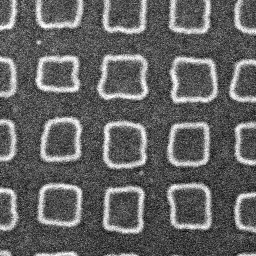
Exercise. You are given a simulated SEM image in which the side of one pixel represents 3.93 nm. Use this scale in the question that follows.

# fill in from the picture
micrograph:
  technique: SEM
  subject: a regular array of raised bodies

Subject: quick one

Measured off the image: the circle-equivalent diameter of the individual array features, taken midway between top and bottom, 170 nanometers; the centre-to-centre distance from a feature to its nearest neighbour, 252 nm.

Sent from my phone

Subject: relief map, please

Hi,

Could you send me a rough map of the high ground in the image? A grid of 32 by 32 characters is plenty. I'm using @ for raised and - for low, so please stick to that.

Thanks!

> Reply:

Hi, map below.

@@---@@@@@---@@@@@----@@@@----@@
@@---@@@@@---@@@@@----@@@@----@@
@@---@@@@@---@@@@@---@@@@@----@@
-------------@@@@@----@@@@----@@
--------------------------------
--------------------------------
--------------------------------
@----@@@@----@@@@@----@@--------
@@---@@@@@---@@@@@----@@@@@---@@
@@---@@@@----@@@@@----@@@@@--@@@
@@---@@@@@---@@@@@----@@@@@--@@@
@@-----------@@@@@----@@@@@--@@@
----------------------@@@@------
--------------------------------
--------------------------------
@-----@@@@----@@----------------
@@----@@@@---@@@@@---@@@@@----@@
@@---@@@@@---@@@@@---@@@@@----@@
@@---@@@@@---@@@@@---@@@@@----@@
@----@@@@@---@@@@@---@@@@@----@@
--------------@@@-----@@@-------
--------------------------------
--------------------------------
------@@@-------------@@@@------
@@---@@@@@---@@@@@---@@@@@----@@
@@---@@@@@---@@@@@---@@@@@----@@
@@---@@@@@---@@@@@----@@@@----@@
@@---@@@@@---@@@@@----@@@@----@@
@-------------@@@@------------@@
--------------------------------
--------------------------------
--------------------------------